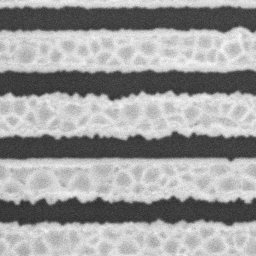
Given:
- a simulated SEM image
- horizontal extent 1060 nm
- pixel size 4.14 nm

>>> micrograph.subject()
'one or a few lines or trenches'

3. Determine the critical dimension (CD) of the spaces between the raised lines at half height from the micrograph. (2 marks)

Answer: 118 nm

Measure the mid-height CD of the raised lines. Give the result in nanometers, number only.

149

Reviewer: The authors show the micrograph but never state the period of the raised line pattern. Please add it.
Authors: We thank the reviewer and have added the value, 64.3 px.